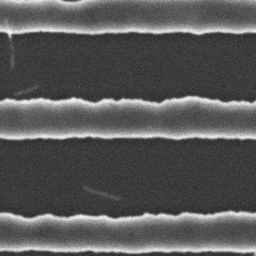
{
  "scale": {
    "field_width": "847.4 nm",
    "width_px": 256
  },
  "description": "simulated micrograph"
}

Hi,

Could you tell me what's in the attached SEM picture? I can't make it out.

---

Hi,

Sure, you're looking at lines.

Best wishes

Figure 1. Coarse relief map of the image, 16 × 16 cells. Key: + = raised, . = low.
++++++++++++++++
++++++++++++++++
................
................
................
................
++++++++++++++++
++++++++++++++++
++++++++++++++++
................
................
................
................
+........+++++++
++++++++++++++++
++++++++++++++++